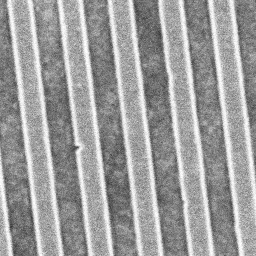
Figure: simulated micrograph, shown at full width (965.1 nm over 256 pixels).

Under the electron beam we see parallel lines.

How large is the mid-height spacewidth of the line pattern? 27.3 px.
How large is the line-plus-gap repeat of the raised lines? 188 nanometers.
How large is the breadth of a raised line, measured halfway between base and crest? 22.4 px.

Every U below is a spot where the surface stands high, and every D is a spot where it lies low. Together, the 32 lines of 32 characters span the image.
DUUUDDDUUUDDDDUUUDDDUUUDDDUUUDDD
DUUUDDDDUUDDDDUUUDDDUUUDDDUUUDDD
DUUUDDDDUUUDDDUUUDDDUUUDDDDUUDDD
DUUUDDDDUUUDDDUUUDDDUUUDDDDUUUDD
DDUUDDDDUUUDDDUUUDDDUUUDDDDUUUDD
DDUUUDDDUUUDDDUUUDDDUUUDDDDUUUDD
DDUUUDDDUUUDDDUUUDDDDUUUDDDUUUDD
DDUUUDDDUUUDDDUUUDDDDUUUDDDUUUDD
DDUUUDDDUUUDDDDUUDDDDUUUDDDUUUDD
DDUUUDDDUUUDDDDUUUDDDUUUDDDUUUDD
DDUUUDDDDUUDDDDUUUDDDUUUDDDUUUDD
DDUUUDDDDUUUDDDUUUDDDUUUDDDDUUDD
DDUUUDDDDUUUDDDUUUDDDUUUDDDDUUUD
DDDUUUDDDUUUDDDUUUDDDUUUDDDDUUUD
DDDUUUDDDUUUDDDUUUDDDDUUUDDDUUUD
DDDUUUDDDUUUDDDUUUDDDDUUUDDDUUUD
DDDUUUDDDUUUDDDDUUUDDDUUUDDDUUUD
DDDUUUDDDUUUDDDDUUUDDDUUUDDDUUUD
DDDUUUDDDDUUDDDDUUUDDDUUUDDDUUUD
DDDUUUDDDDUUUDDDUUUDDDUUUDDDDUUD
DDDDUUDDDDUUUDDDUUUDDDUUUDDDDUUU
DDDDUUDDDDUUUDDDUUUDDDUUUDDDDUUU
DDDDUUUDDDUUUDDDUUUDDDDUUDDDDUUU
DDDDUUUDDDUUUDDDUUUDDDDUUUDDDUUU
UDDDUUUDDDUUUDDDDUUDDDDUUUDDDUUU
UDDDUUUDDDUUUDDDDUUDDDDUUUDDDUUU
UDDDUUUDDDDUUDDDDUUUDDDUUUDDDUUU
UDDDUUUDDDDUUUDDDUUUDDDUUUDDDDUU
UDDDUUUDDDDUUUDDDUUUDDDUUUDDDDUU
UDDDDUUDDDDUUUDDDUUUDDDUUUDDDDUU
UDDDDUUUDDDUUUDDDUUUDDDDUUDDDDUU
UDDDDUUUDDDUUUDDDUUUDDDDUUUDDDUU